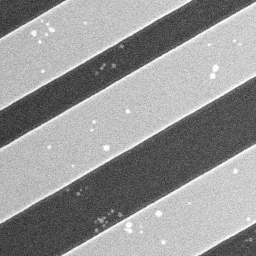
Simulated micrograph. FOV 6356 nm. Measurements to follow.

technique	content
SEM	lines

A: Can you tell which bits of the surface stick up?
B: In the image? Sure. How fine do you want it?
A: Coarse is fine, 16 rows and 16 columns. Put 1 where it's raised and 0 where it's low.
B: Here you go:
0001111111100001
0011111110000011
1111111100001111
1111110000111111
1111000011111111
1100000111111110
1000011111111000
0001111111100000
0111111110000000
1111111100000001
1111110000000111
1111000000001111
1110000000111111
1000000011111111
0000001111111110
0000011111111000